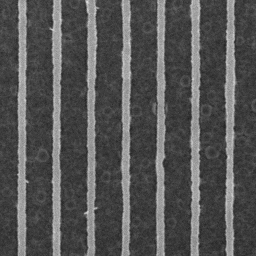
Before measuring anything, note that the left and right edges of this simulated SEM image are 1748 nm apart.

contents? parallel lines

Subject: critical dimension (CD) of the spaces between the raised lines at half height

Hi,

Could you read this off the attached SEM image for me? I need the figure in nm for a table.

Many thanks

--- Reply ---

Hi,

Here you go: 189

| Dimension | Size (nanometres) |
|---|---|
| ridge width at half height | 47.8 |